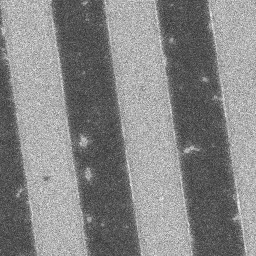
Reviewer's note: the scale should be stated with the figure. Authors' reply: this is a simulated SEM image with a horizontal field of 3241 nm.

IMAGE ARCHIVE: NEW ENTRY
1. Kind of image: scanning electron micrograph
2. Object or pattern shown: one or a few lines or trenches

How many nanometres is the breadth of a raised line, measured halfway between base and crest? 687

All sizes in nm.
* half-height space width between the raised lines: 614